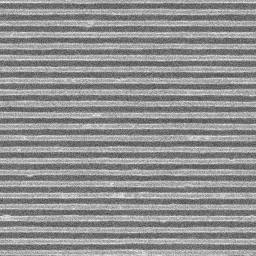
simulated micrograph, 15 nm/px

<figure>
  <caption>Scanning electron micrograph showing parallel lines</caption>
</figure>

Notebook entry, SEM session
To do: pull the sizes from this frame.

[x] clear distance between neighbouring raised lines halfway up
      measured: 0.103 µm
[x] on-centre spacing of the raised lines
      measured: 172 nm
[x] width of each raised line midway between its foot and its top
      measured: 75 nm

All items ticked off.